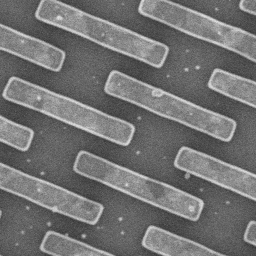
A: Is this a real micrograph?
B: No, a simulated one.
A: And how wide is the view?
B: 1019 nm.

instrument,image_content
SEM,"groups of lines, slits or small figures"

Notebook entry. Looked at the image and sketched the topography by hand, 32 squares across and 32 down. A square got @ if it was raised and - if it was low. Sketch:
-----@@@----------@@@@--------@@
-----@@@@@--------@@@@@@-------@
-----@@@@@@@@-------@@@@@@@-----
@-------@@@@@@@-------@@@@@@@---
@@@-------@@@@@@@@------@@@@@@@@
@@@@@@------@@@@@@@@-------@@@@@
-@@@@@@@-------@@@@@@---------@@
----@@@@----------@@------------
------@-------------------------
--------------@@-----------@@---
-@@@---------@@@@@--------@@@@@@
-@@@@@--------@@@@@@@-------@@@@
-@@@@@@@@-------@@@@@@@-------@@
----@@@@@@@-------@@@@@@@-------
-------@@@@@@@------@@@@@@@@----
@@-------@@@@@@@-------@@@@@@---
@@@@-------@@@@@@---------@@@---
@@@@----------@@----------------
--@-----------------------------
----------@@----------@@@@------
---------@@@@@--------@@@@@@----
@@--------@@@@@@@-------@@@@@@@-
@@@@@-------@@@@@@@-------@@@@@@
@@@@@@@-------@@@@@@@@------@@@@
---@@@@@@@-------@@@@@@@-------@
-----@@@@@@@-------@@@@@@-------
-------@@@@@@---------@@@-------
----------@@--------------------
-------------------------------@
------@@----------@@@@---------@
-----@@@@@@-------@@@@@@@-------
------@@@@@@@-------@@@@@@@-----